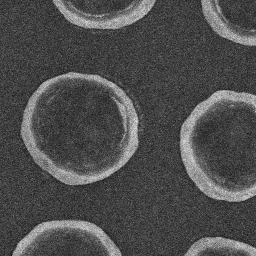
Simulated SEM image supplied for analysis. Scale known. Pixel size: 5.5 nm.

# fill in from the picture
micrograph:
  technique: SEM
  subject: raised bodies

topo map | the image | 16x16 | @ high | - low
----@@@@@----@@@
------@-------@@
---------------@
----------------
----------------
---@@@@---------
--@@@@@@-----@@@
--@@@@@@----@@@@
--@@@@@@----@@@@
--@@@@@@----@@@@
---@@@@-----@@@@
-------------@@@
----------------
----------------
--@@@@----------
-@@@@@@-----@@@@